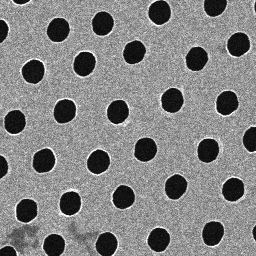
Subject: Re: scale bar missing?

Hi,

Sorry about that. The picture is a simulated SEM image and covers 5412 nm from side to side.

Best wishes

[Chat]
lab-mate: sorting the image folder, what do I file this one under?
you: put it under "a regular array of holes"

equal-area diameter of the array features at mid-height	496	nm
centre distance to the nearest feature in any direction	981	nm